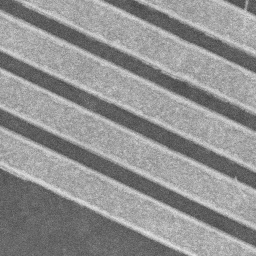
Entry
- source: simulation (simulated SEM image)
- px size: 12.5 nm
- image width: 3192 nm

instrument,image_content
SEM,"parallel lines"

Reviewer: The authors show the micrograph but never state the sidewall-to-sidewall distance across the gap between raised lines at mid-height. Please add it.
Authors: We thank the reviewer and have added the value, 265 nm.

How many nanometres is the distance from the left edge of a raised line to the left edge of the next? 650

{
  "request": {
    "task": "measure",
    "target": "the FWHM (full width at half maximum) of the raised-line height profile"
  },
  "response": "386 nm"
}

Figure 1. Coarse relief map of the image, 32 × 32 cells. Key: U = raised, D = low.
DDDDUUUUUUUUUDDDDDDUUUUUUUUUDDDD
DDDDDDUUUUUUUUUDDDDDDUUUUUUUUUDD
UUDDDDDDUUUUUUUUUDDDDDDUUUUUUUUU
UUUUDDDDDDUUUUUUUUUDDDDDDUUUUUUU
UUUUUUDDDDDDUUUUUUUUUDDDDDDUUUUU
UUUUUUUUDDDDDDUUUUUUUUUDDDDDDDUU
DUUUUUUUUUDDDDDDUUUUUUUUUDDDDDDD
DDDUUUUUUUUUDDDDDDDUUUUUUUUUDDDD
DDDDDUUUUUUUUUDDDDDDDUUUUUUUUUDD
UDDDDDDDUUUUUUUUDDDDDDDUUUUUUUUU
UUUDDDDDDDUUUUUUUUUDDDDDDUUUUUUU
UUUUUDDDDDDDUUUUUUUUUDDDDDDUUUUU
UUUUUUUUDDDDDDUUUUUUUUUDDDDDDUUU
DUUUUUUUUUDDDDDDUUUUUUUUUDDDDDDU
DDDUUUUUUUUUDDDDDDUUUUUUUUUDDDDD
DDDDDUUUUUUUUUDDDDDDUUUUUUUUUDDD
UDDDDDDUUUUUUUUUDDDDDDDUUUUUUUUD
UUUDDDDDDUUUUUUUUUDDDDDDDUUUUUUU
UUUUUDDDDDDDUUUUUUUUDDDDDDDUUUUU
UUUUUUUDDDDDDDUUUUUUUUDDDDDDDUUU
UUUUUUUUUDDDDDDDUUUUUUUUDDDDDDDU
DDDUUUUUUUUDDDDDDDUUUUUUUUDDDDDD
DDDDDUUUUUUUUDDDDDDDUUUUUUUUUDDD
DDDDDDDUUUUUUUUDDDDDDDUUUUUUUUUD
DDDDDDDDDUUUUUUUUUDDDDDDUUUUUUUU
DDDDDDDDDDDUUUUUUUUUDDDDDDUUUUUU
DDDDDDDDDDDDDUUUUUUUUUDDDDDDUUUU
DDDDDDDDDDDDDDDUUUUUUUUUDDDDDDUU
DDDDDDDDDDDDDDDDDUUUUUUUUUDDDDDD
DDDDDDDDDDDDDDDDDDDUUUUUUUUUDDDD
DDDDDDDDDDDDDDDDDDDDDUUUUUUUUUDD
DDDDDDDDDDDDDDDDDDDDDDDUUUUUUUUU